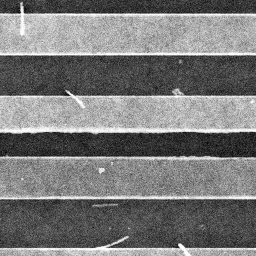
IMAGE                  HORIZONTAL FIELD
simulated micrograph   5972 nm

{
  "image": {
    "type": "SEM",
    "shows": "lines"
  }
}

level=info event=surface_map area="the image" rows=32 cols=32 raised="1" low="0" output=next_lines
00000000000000000000000000000000
00000000000000000000000000000000
11111111111111111111111111111111
11111111111111111111111111111111
11111111111111111111111111111111
11111111111111111111111111111111
11111111111111111111111111111111
00000000000000000000000000000000
00000000000000000000000000000000
00000000000000000000000000000000
00000000000000000000000000000000
00000000000000000000000000000000
11111111111111111111111111111111
11111111111111111111111111111111
11111111111111111111111111111111
11111111111111111111111111111111
01100000000010000000000001100000
00000000000000000000000000000000
00000000000000000000000000000000
00000000000000000000000000000000
11111111111111111111111111111111
11111111111111111111111111111111
11111111111111111111111111111111
11111111111111111111111111111111
11111111111111111111111111111111
00000000000000000000000000000000
00000000000000000000000000000000
00000000000000000000000000000000
00000000000000000000000000000000
00000000000000000000000000000000
00000000000000000000000000000000
11111111111111111111111111111111